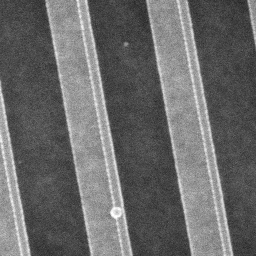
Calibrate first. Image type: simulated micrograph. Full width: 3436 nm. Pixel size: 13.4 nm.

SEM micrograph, lines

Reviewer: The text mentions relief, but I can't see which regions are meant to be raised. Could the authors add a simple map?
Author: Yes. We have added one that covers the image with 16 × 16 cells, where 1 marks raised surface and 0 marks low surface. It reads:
0001100001110000
0001110001110000
0001110000110000
0001110000110000
0000110000111000
0000110000111000
0000111000111000
0000111000111000
1000111000011000
1000011000011000
1000011000011100
1000011000011100
1000011100011100
1000011100001100
1100011100001100
1100001100001100